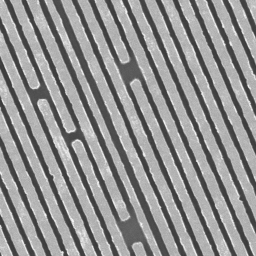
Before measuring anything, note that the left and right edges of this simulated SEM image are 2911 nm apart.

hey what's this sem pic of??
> parallel lines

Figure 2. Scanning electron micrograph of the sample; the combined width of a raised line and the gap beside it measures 176 nm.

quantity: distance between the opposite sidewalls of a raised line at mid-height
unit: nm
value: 124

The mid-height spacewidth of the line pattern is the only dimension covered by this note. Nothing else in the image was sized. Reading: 57.4 nm